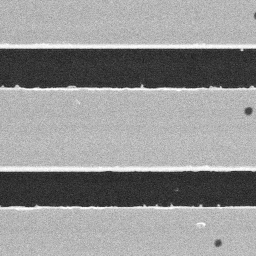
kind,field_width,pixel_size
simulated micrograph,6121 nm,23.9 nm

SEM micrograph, lines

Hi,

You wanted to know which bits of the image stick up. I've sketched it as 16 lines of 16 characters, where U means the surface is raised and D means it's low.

UUUUUUUUUUUUUUUU
UUUUUUUUUUUUUUUU
UUUUUUUUUUUUUUUU
DDDDDDDDDDDDDDDD
DDDDDDDDDDDDDDDD
DDDDDDDDDDDDDDDD
UUUUUUUUUUUUUUUU
UUUUUUUUUUUUUUUU
UUUUUUUUUUUUUUUU
UUUUUUUUUUUUUUUU
UUUUUUUUUUUUUUUU
DDDDDDDDDDDDDDDD
DDDDDDDDDDDDDDDD
UUUUUUUUUUUUUUUU
UUUUUUUUUUUUUUUU
UUUUUUUUUUUUUUUU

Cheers